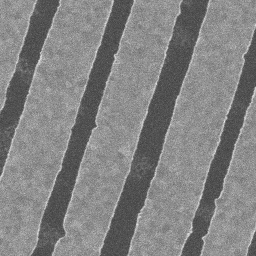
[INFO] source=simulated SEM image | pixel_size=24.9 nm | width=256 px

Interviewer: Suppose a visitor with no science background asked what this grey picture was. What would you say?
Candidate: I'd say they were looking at one or a few lines or trenches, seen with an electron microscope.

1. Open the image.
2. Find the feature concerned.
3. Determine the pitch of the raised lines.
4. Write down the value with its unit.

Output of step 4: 1780 nm